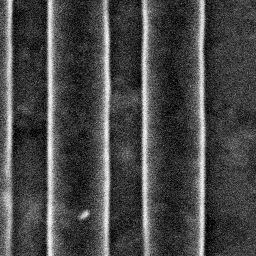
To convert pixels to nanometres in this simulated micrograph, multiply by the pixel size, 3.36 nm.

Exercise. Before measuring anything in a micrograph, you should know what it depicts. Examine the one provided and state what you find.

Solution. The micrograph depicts wiring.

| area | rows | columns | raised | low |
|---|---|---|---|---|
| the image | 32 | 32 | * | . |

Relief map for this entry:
*.....*******.....*******.......
*.....*******.....*******.......
*.....*******.....*******.......
*.....*******.....*******.......
*.....*******.....*******.......
*.....*******.....*******.......
*.....*******.....*******.......
*.....*******.....*******.......
*.....*******.....*******.......
*.....********....*******.......
*.....********....*******.......
*.....********....*******.......
*.....*******.....*******.......
*.....*******.....*******.......
*.....*******.....*******.......
*.....*******.....*******.......
*.....*******.....*******.......
*.....*******.....*******.......
*.....*******.....*******.......
*.....*******.....*******.......
*.....*******.....*******.......
*.....********....*******.......
*.....********....*******.......
*.....********....*******.......
*.....*******.....*******.......
*.....*******.....*******.......
*.....*******.....*******.......
*.....*******.....*******.......
*.....*******.....*******.......
*.....*******.....*******.......
*.....*******.....*******.......
*.....*******.....*******.......